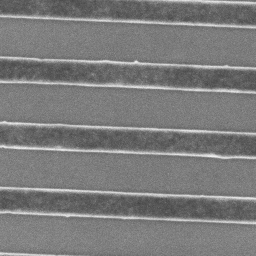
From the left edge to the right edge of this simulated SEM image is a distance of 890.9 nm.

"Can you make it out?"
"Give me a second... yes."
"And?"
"one or a few lines or trenches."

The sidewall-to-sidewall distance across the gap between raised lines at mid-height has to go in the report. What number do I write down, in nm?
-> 138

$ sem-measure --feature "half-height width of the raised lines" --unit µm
0.0874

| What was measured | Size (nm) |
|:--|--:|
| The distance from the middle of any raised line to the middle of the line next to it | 227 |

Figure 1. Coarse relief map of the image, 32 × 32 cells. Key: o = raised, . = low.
oooooooooooooooooooooooooooooooo
oooooooooooooooooooooooooooooooo
..........oooooooooooooooooooooo
................................
................................
................................
................................
ooooooo.........................
oooooooooooooooooooooooooooooooo
oooooooooooooooooooooooooooooooo
........oooooooooooooooooooooooo
.............................ooo
................................
................................
................................
ooooo...........................
oooooooooooooooooooooooooooo....
oooooooooooooooooooooooooooooooo
.ooooooooooooooooooooooooooooooo
..........................oooooo
................................
................................
................................
................................
oooooooooooooooooooooooo........
oooooooooooooooooooooooooooooooo
oooooooooooooooooooooooooooooooo
......................oooooooooo
................................
................................
................................
................................